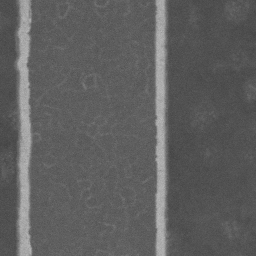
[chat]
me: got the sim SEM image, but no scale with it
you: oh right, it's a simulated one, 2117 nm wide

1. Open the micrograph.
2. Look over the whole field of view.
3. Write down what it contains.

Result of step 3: one or a few lines or trenches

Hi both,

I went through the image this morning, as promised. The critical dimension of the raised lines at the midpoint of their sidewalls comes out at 1.13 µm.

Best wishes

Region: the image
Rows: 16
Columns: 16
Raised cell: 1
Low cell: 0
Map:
0011111111000000
0011111111000000
0111111111000000
0111111111000000
0111111111000000
0011111111000000
0011111111000000
0011111111000000
0011111111000000
0011111111000000
0111111111000000
0011111111000000
0011111111000000
0111111111000000
0011111111000000
0011111111000000